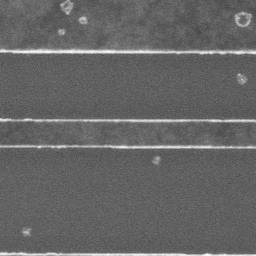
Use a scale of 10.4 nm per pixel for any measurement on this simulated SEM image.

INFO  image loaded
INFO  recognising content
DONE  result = lines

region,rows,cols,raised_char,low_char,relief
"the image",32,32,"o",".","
oooooooooooooooooooooooooooooooo
oooooooooooooooooooooooooooooooo
oooooooooooooooooooooooooooooooo
oooooooooooooooooooooooooooooooo
oooooooooooooooooooooooooooooooo
oooooooooooooooooooooooooooooooo
.ooooooooooooooooooooooooooooooo
................................
................................
................................
................................
................................
................................
................................
................................
oooooooooooooooooooooooooooooooo
oooooooooooooooooooooooooooooooo
oooooooooooooooooooooooooooooooo
................................
................................
................................
................................
................................
................................
................................
................................
................................
................................
................................
................................
................................
................................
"